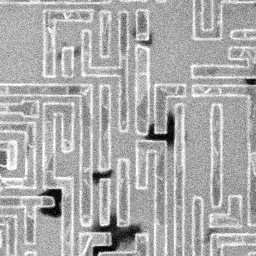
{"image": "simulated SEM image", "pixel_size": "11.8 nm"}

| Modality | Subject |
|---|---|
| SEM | wiring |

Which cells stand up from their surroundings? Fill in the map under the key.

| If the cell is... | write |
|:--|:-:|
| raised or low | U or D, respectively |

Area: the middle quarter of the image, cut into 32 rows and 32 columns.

UUDDDUUDDDDDDDUUDDUUUDDDDDDDDDDD
UUDDDUUUUUUUUUUUDDUUUDDDDDDDDDDD
UUDDDUUUUUUUUUUUDDUUUDDDDDDDDDDD
DDDDDDDDDDDDDDUUDDUUUDDDDDDDDDDD
DDDDDDDDDDDDDDUUDDUUUDDDDDDDDDDD
UUUUUUUDDDUDDDUUDDUUUDDUUUUUUUDD
UUUUUUUDDUUDDDUUDDUUUDDUUUUUUUDD
UUUUUUUDDUUDDDUUDDUUUDDUUUUUUUDD
DDDDUUUDDUUDDDUUDDUUUDDUUUDDDDDD
DDDDUUUDDUUDDDUUDDUUUDDUUUDDDDDD
UUDDUUUDDUUDDDUUDDUUUDDUUUDDUUDD
UUDDUUUDDUUDDDUUDDUUUDDUUUDDUUDD
UUDDUUUDDUUDDDUUDDUUUDDUUUDDUUDD
UUDDUUUDDUUDDDUUDDUUUDDUUUDDUUDD
UUDDUUUDDUUDDDUUDDUUUDDUUUDDUUDD
UUDDUUUDDUUDDDUUDDUUUDDUUUDDUUDD
UUDDUUUDDUUDDDUUDDUUUDDUUUDDUUDD
UUDDUUUDDUUDDDDDDDDDUDDDDDDDUUDD
UUDDUUUDDUUDDDDDDDDDDDDDDDDDUUDD
UUDDUUUDDUUDDDDDDDUUUUUUUDDDUUDD
UUDDUUUDDUUDDDDDDDUUUUUUUDDDUUDD
UUDDUUUDDUUDDDDDDDUUUUUUUDDDUUDD
DDDDUUUDDUUDDDDDDDUUUDDUUDDDUUDD
DDDDUUUDDUUDDDDDDDUUUDDUUDDDUUDD
DDDDUUUDDUUDDDUUDDUUUDDUUDDDUUDD
DDDDUUUDDUUDDDUUDDUUUDDUUDDDUUDD
DDDDUUUDDDDDDDUUDDUUUDDUUDDDUUDD
DDDDUUUDDDDDDDUUDDUUUDDUUDDDUUDD
UUDDUUUDDDDDDDUUDDUUUDDUUDDDUUDD
UUDDUUUDDUUDDDUUDDUUUDDUUDDDUUDD
UUDDUUUDDUUDDDUUDDUUUDDUUDDDUUDD
UUDDUUUDDUUDDDUUDDDDDDDUUUDDUUDD